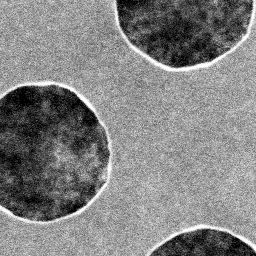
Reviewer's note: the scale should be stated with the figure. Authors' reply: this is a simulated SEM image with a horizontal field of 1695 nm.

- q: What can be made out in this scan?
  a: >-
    holes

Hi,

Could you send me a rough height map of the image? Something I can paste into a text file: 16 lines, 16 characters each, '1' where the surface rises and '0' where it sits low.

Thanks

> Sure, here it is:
1111111000000000
1111111000000000
1111111100000001
1111111110000011
1111111111111111
1000111111111111
0000011111111111
0000001111111111
0000000111111111
0000000111111111
0000000111111111
0000000111111111
0000001111111111
1000111111111111
1111111111110011
1111111111000000